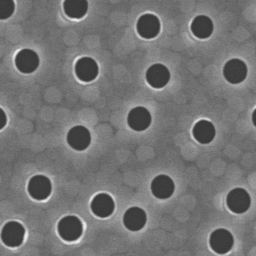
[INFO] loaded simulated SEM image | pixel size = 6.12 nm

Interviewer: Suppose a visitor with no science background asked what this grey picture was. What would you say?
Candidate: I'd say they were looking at a regular array of holes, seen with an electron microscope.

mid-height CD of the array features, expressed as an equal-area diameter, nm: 150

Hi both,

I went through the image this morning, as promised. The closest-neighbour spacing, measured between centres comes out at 308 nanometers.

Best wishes